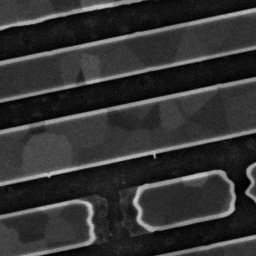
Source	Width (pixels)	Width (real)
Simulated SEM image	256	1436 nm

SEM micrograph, one or a few lines or trenches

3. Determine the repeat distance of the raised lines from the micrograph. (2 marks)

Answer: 76.1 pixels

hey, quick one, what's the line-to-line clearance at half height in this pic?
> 178 nm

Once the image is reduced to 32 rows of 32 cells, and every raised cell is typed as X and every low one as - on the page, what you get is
XXXXXXXXXXXXXX------------------
XXXXXXXXX----------------------X
XXXXX---------------------XXXXXX
---------------------XXXXXXXXXXX
----------------XXXXXXXXXXXXXXXX
------------XXXXXXXXXXXXXXXXXXXX
-------XXXXXXXXXXXXXXXXXXXXXXX--
--XXXXXXXXXXXXXXXXXXXXXXX-------
XXXXXXXXXXXXXXXXXXXX------------
XXXXXXXXXXXXXXX-----------------
XXXXXXXXXX-------------------XXX
XXXXXX------------------XXXXXXXX
X------------------XXXXXXXXXXXXX
---------------XXXXXXXXXXXXXXXXX
---------XXXXXXXXXXXXXXXXXXXXXXX
-----XXXXXXXXXXXXXXXXXXXXXXXXXXX
XXXXXXXXXXXXXXXXXXXXXXXXXXXXXXX-
XXXXXXXXXXXXXXXXXXXXXXXXXXX-----
XXXXXXXXXXXXXXXXXXXXXX----------
XXXXXXXXXXXXXXXXX---------------
XXXXXXXXXXXX--------------------
XXXXXXX------------------------X
XXX-------------------XXXXXXX--X
------------------XXXXXXXXXXX--X
-----------------XXXXXXXXXXXX--X
--------XXX------XXXXXXXXXXXX---
---XXXXXXXX------XXXXXXXXXXXX---
XXXXXXXXXXX------XXXXXXXX-------
XXXXXXXXXXX--------X------------
XXXXXXXXXXXX--------------------
XXXXXXXXXXX----------------XXXXX
XXXXXX-----------------XXXXXXXXX